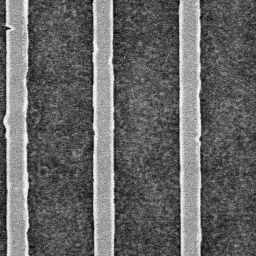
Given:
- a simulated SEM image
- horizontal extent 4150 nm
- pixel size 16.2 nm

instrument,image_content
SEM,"one or a few lines or trenches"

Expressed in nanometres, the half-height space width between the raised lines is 1120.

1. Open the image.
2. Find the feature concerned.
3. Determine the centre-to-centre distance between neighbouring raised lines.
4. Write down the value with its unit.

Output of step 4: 1.4 micrometres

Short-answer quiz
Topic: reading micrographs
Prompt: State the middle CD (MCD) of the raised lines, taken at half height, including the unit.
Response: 0.288 um